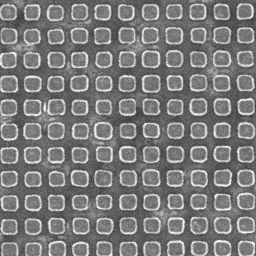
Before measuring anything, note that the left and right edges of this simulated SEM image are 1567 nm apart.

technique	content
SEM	a regular array of raised bodies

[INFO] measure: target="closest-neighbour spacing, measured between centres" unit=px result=23.3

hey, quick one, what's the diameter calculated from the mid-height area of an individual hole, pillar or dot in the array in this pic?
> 104 nm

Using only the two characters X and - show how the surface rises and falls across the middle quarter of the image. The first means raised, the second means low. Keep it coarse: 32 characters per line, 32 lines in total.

--XXXX--XXX---XXX---XXX---XXX---
--------------------------------
--------------------------------
--XXXX--XXXX--XXXX--XXXX--XXX---
--XXXX--XXXX--XXXX--XXXX--XXX---
--XXXX--XXXX--XXXX--XXXX--XXX---
--XXX---XXX---XXX---XXXX--------
--------------------------------
--------------------------------
--XXX---XXXX--XXXX--XXXX--XXXX--
--XXXX--XXXX--XXXX--XXXX--XXXX--
--XXXX--XXXX--XXXX--XXXX--XXXX--
---XX----XX---XXX----------XX---
--------------------------------
--------------------------------
--XXXX--XXXX--XXXX--XXXX--XXXX--
--XXXX--XXXX--XXXX--XXXX--XXXX--
--XXXX--XXXX--XXXX--XXXX--XXXX--
---XX----XX----------------X----
--------------------------------
--------------------------------
--XXX---XXXX--XXXX--XXXX--XXXX--
--XXXX--XXXX--XXXX--XXXX--XXXX--
--XXXX--XXXX--XXXX--XXXX--XXXX--
---XX------X--------XXX---------
--------------------------------
--------------------------------
--XXXX--XXXX--XXXX--XXXX--XXXX--
--XXXX--XXXX--XXXX--XXXX--XXXX--
--XXXX--XXXX--XXXX--XXXX--XXXX--
----X---XXX---------------XX----
--------------------------------